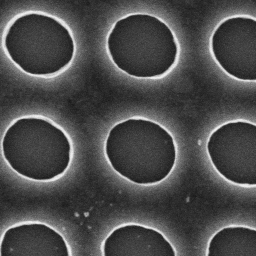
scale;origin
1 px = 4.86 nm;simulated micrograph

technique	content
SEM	holes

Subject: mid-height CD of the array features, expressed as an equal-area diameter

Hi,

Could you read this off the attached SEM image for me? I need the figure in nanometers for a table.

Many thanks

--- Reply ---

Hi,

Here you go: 322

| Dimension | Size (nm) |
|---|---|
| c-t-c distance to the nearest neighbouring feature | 504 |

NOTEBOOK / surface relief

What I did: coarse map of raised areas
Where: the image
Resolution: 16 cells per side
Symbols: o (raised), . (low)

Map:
oooooooooooooooo
o...ooo...oooo..
.....oo....oo...
o....oo....oo...
oo..oooo..oooo..
oooooooooooooooo
oooooooooooooooo
o..ooooo.ooooooo
....ooo....oo...
....ooo....oo...
o...ooo....ooo..
ooooooooooooooo.
oooooooooooooooo
oooooooooooooooo
....ooo...oooo..
....oo.....oo...